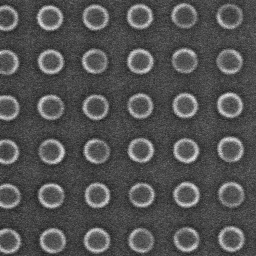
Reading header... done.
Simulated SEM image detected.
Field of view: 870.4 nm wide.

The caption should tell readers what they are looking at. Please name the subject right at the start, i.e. a regular array of raised bodies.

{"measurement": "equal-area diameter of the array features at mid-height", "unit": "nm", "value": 82.3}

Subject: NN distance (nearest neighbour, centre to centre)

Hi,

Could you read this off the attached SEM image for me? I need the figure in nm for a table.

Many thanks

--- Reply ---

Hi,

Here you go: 150